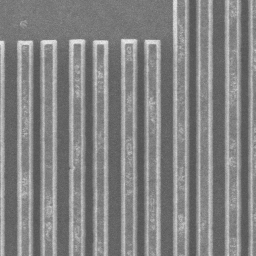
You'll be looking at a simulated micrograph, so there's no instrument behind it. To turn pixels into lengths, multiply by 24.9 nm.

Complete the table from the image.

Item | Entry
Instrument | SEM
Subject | parallel lines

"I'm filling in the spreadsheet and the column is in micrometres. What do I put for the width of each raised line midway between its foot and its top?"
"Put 0.317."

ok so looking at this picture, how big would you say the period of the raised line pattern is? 26 px